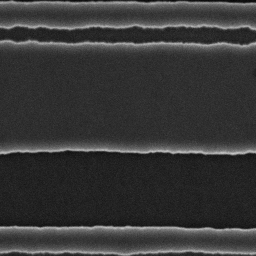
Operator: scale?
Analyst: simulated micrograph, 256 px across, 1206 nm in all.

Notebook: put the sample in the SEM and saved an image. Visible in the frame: lines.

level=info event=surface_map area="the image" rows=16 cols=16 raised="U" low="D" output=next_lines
UUUUUUUUUUUUUUUU
UUUUUUUUUUUUUUUU
UUUUUUUUUUUUUUUU
UUUUUUUUUUUUUUUU
UUUUUUUUUUUUUUUU
UUUUUUUUUUUUUUUU
UUUUUUUUUUUUUUUU
UUUUUUUUUUUUUUUU
UUUUUUUUUUUUUUUU
UUDDDDDDUUUUUUUU
DDDDDDDDDDDDDDDD
DDDDDDDDDDDDDDDD
DDDDDDDDDDDDDDDD
DDDDDDDDDDDDDDDD
UUUUUUUUUUUUUUUU
UUUUUUUUUUUUUUUU